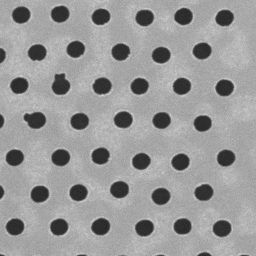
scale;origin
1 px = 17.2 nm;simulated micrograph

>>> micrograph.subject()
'a regular array of holes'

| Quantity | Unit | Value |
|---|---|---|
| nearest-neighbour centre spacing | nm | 662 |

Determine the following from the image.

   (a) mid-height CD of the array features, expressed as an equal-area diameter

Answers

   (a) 0.311 microns